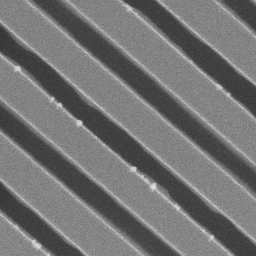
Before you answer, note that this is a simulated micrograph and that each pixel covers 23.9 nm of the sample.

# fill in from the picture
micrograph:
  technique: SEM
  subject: lines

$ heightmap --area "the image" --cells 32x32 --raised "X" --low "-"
XXXX-----XXXXXXX----XXXXXXX-----
XXXXX-----XXXXXXX----XXXXXXXX---
XXXXXX-----XXXXXXX----XXXXXXXX--
-XXXXXX-----XXXXXXX-----XXXXXXX-
--XXXXXX-----XXXXXXX-----XXXXXXX
---XXXXXXX-----XXXXXX-----XXXXXX
----XXXXXXX-----XXXXXXX----XXXXX
X-----XXXXXX-----XXXXXXX----XXXX
XX-----XXXXXX-----XXXXXXX----XXX
XXX-----XXXXXX-----XXXXXXX-----X
XXXXX----XXXXXX-----XXXXXXX-----
XXXXXX----XXXXXXX----XXXXXXX----
XXXXXXX----XXXXXXX-----XXXXXX---
-XXXXXXX----XXXXXXX-----XXXXXXX-
---XXXXXX-----XXXXXX-----XXXXXXX
----XXXXXX-----XXXXXX-----XXXXXX
-----XXXXXX-----XXXXXX-----XXXXX
X-----XXXXXX-----XXXXXX-----XXXX
XX-----XXXXXXX----XXXXXXX----XXX
XXX-----XXXXXXX----XXXXXXX-----X
XXXXX-----XXXXXX-----XXXXXX-----
XXXXXX-----XXXXXX-----XXXXXX----
XXXXXXX-----XXXXXX-----XXXXXX---
-XXXXXXX-----XXXXXXX----XXXXXXX-
--XXXXXXX-----XXXXXXX----XXXXXXX
---XXXXXXX-----XXXXXXX----XXXXXX
-----XXXXXXX-----XXXXXX-----XXXX
X-----XXXXXXX-----XXXXXX-----XXX
XX-----XXXXXXX-----XXXXXX-----XX
XXX-----XXXXXXX-----XXXXXX-----X
XXXXX----XXXXXXX-----XXXXXX-----
XXXXXX----XXXXXXX-----XXXXXXX---